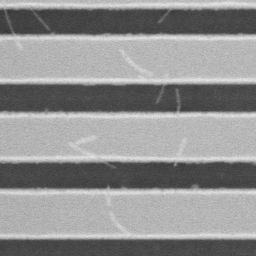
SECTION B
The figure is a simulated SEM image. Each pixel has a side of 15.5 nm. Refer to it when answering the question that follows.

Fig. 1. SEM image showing lines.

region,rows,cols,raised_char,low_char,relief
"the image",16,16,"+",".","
++........+.....
................
++++++++++++++++
++++++++++++++++
++++++++++++++++
................
................
++++++++++++++++
++++++++++++++++
++++++++++++++++
................
................
++++++++++++++++
++++++++++++++++
++++++++++++++++
................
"